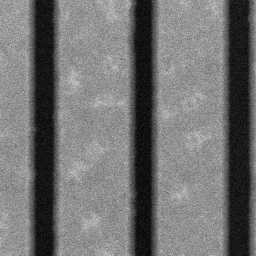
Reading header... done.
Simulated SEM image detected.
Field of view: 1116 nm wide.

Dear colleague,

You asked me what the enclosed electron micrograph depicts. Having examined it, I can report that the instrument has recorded one or a few lines or trenches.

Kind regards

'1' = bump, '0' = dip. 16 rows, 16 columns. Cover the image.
1100111100111100
1100111100111100
1100111100111100
1100111100111100
1100111100111100
1100111100111100
1100111100111100
1100111100111100
1100111100111100
1100111100111100
1100111100111100
1100111100111100
1100111100111100
1100111100111100
1100111100111100
1100111100111100